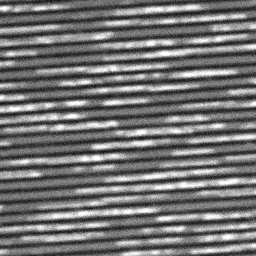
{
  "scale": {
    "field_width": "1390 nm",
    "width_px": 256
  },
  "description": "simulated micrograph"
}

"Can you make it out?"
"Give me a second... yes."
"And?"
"parallel lines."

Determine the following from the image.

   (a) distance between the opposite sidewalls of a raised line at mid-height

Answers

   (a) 0.0325 µm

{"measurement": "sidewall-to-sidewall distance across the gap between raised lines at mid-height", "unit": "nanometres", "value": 28.4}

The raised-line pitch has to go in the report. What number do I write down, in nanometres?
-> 59.9